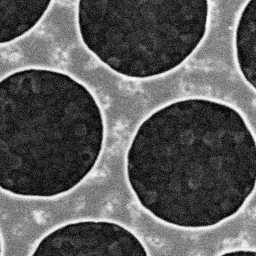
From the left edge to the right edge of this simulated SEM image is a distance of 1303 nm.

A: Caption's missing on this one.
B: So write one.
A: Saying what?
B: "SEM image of holes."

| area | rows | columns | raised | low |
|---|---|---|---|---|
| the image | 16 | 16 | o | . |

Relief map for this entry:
...oo........oo.
..ooo........oo.
.oooo........oo.
oooooo......ooo.
o..oooo...ooooo.
.....ooooooooooo
......ooooo...oo
......ooo......o
......oo........
......oo........
......oo........
.....ooo........
ooooooooo......o
oooooooooo....oo
ooo.....oooooooo
oo.......ooooooo